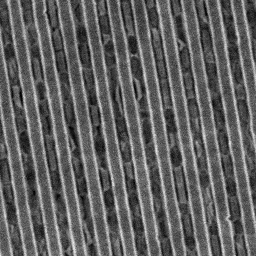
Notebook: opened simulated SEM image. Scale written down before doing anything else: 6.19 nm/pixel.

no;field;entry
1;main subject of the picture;parallel lines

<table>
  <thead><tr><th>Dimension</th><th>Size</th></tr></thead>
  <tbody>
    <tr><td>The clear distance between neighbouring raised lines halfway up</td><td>75.5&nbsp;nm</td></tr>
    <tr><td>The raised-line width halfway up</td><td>75.5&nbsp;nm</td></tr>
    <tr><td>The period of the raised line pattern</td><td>152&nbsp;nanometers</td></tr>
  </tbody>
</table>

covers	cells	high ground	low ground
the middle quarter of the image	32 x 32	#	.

.###...###...####...###...###...
.###...###...####...###...###...
.###....##....###...###...###...
.####...###...###...###...###...
..###...###...###...###...####..
..###...###...###....###..####..
..###...###...###....###...###..
..###...###....###...###...###..
..###...###....###...###...###..
..####...###...###...###...###..
...###...###...###...###....###.
...###...###...###....###...###.
...###...###...###....###...###.
...###...###...####...###...###.
...###....###...###...###...###.
...####...###...###...###...###.
....###...###...###...###....###
#...###...###...###...####...###
#...###...###....##...####...###
#...###...###....###...###...###
#...###...####...###...###...###
#...###....###...###...###...###
##...###...###...###...###....##
##...###...###...###...###....##
##...###...###...###....##....##
##...###...###....###...###...##
##...###...####...###...###...##
##...####...###...###...###...##
##....###...###...###...###....#
###...###...###...###....##....#
###...###...###...###....##....#
###...###...###...####...###...#